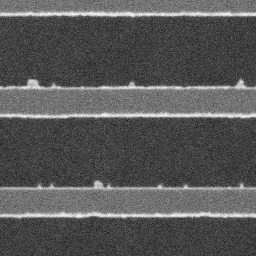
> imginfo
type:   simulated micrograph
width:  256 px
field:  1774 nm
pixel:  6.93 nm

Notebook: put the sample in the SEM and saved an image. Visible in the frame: lines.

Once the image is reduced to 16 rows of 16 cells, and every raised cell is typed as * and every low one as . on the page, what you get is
****************
................
................
................
................
****..**********
****************
................
................
................
................
................
****************
****************
................
................